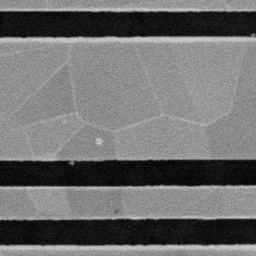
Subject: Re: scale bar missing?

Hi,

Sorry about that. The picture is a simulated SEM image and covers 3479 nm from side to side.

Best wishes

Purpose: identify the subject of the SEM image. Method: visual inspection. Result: lines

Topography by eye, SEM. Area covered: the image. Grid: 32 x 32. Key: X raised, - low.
XXXXXXXXXXXXXXXXXXXXXXXXXXXXXXXX
--------------------------------
--------------------------------
--------------------------------
--------------------------------
XXXXXXXXXXXXXXXXXXXXXXXXXXXXXXXX
XXXXXXXXXXXXXXXXXXXXXXXXXXXXXXXX
XXXXXXXXXXXXXXXXXXXXXXXXXXXXXXXX
XXXXXXXXXXXXXXXXXXXXXXXXXXXXXXXX
XXXXXXXXXXXXXXXXXXXXXXXXXXXXXXXX
XXXXXXXXXXXXXXXXXXXXXXXXXXXXXXXX
XXXXXXXXXXXXXXXXXXXXXXXXXXXXXXXX
XXXXXXXXXXXXXXXXXXXXXXXXXXXXXXXX
XXXXXXXXXXXXXXXXXXXXXXXXXXXXXXXX
XXXXXXXXXXXXXXXXXXXXXXXXXXXXXXXX
XXXXXXXXXXXXXXXXXXXXXXXXXXXXXXXX
XXXXXXXXXXXXXXXXXXXXXXXXXXXXXXXX
XXXXXXXXXXXXXXXXXXXXXXXXXXXXXXXX
XXXXXXXXXXXXXXXXXXXXXXXXXXXXXXXX
XXXXXXXXXXXXXXXXXXXXXXXXXXXXXXXX
--------------------------------
--------------------------------
--------------------------------
XXXXXXXXXXXXXXXXXXXXXXXXXXXXXXXX
XXXXXXXXXXXXXXXXXXXXXXXXXXXXXXXX
XXXXXXXXXXXXXXXXXXXXXXXXXXXXXXXX
XXXXXXXXXXXXXXXXXXXXXXXXXXXXXXXX
--------------------------------
--------------------------------
--------------------------------
--------------------------------
XXXXXXXXXXXXXXXXXXXXXXXXXXXXXXXX